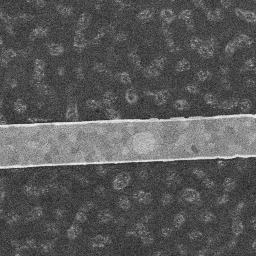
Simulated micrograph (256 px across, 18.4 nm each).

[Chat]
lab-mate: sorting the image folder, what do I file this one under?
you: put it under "one or a few lines or trenches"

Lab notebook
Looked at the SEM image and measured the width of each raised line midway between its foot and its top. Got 750 nm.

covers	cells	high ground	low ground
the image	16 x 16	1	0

0000000000000000
0000000000000000
0000000000000000
0000000000000000
0000000000000000
0000000000000000
0000000000000000
0000000000111111
1111111111111111
1111111111111111
0000000000000000
0000000000000000
0000000000000000
0000000000000000
0000000000000000
0000000000000000